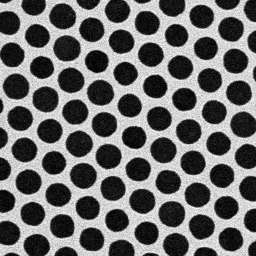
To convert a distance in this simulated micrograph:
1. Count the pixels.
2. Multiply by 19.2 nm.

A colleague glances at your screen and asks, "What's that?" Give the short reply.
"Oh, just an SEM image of a regular array of holes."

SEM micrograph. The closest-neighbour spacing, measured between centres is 0.607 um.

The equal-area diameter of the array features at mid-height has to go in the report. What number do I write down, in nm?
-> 484